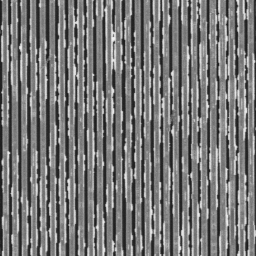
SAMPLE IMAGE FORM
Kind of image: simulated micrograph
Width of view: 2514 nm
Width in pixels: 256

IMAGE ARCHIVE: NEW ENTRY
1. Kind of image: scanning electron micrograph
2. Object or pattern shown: parallel lines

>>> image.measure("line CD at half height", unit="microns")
0.0651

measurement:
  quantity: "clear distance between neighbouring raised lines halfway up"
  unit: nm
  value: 28.2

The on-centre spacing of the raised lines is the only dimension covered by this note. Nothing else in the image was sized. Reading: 92.9 nanometers